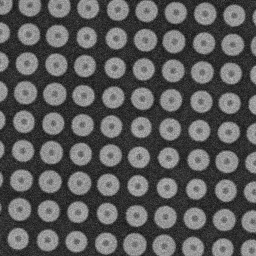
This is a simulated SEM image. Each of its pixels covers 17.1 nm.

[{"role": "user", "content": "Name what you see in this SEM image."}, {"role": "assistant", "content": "an array of small figures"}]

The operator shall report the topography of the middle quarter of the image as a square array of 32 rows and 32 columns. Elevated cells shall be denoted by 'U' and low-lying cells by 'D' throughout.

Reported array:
UDDUUUUUDDUUUUUDDUUUUUDDDUUUUUDD
UDDUUUUUDDUUUUUDDUUUUUUDDUUUUUDD
DDDUUUUDDDDUUUUDDDUUUUDDDUUUUUDD
DDDDDDDDDDDDUDDDDDUUUDDDDUUUUDDD
DDDDDDDDDDDDDDDDDDDDDDDDDDDDDDDD
DDDDUUDDDDDDDDDDDDDDDDDDDDDDDDDD
DDDUUUUDDDUUUUDDDDUUUDDDDDUUDDDD
UDUUUUUUDDUUUUUDDUUUUUDDDUUUUDDD
DDUUUUUUDDUUUUUDDUUUUUDDUUUUUDDD
DDDUUUUDDDUUUUUDDUUUUUDDUUUUUDDD
DDDDDDDDDDDUUUDDDDUUUUDDUUUUUDDD
DDDDDDDDDDDDDDDDDDDDDDDDDDUUDDDD
DDDDDDDDDDDDDDDDDDDDDDDDDDDDDDDD
DDDUUUUDDDUUUUDDDDUUDDDDDDDDDDDD
DDUUUUUDDUUUUUDDDUUUUUDDDUUUDDDD
DDUUUUUDDUUUUUDDDUUUUUDDUUUUUDDD
DDUUUUUDDUUUUUDDDUUUUUDDUUUUUDDU
DDDUUUDDDDUUUUDDDUUUUDDDUUUUUDDU
DDDDDDDDDDDDDDDDDDDDDDDDDUUUDDDD
DDDDDDDDDDDDDDDDDDDDDDDDDDDDDDDD
DDUUUUDDDDUUUDDDDDDDDDDDDDDDDDDD
DDUUUUUDDUUUUUDDDUUUUDDDDUUUDDDD
DDUUUUUDDUUUUUDDUUUUUDDDUUUUDDDU
DDUUUUUDDUUUUUDDUUUUUDDDUUUUUDDU
DDUUUUDDDUUUUUDDUUUUUDDDUUUUDDDU
DDDDDDDDDDDUDDDDDUUUDDDDDUUUDDDU
DDDDDDDDDDDDDDDDDDDDDDDDDDDDDDDD
DDUUUUDDDDDDDDDDDDDDDDDDDDDDDDDD
DUUUUUDDDUUUUDDDDUUUDDDDDDDDDDDD
DUUUUUUDUUUUUUDDUUUUUDDDUUUUDDDU
DUUUUUUDUUUUUUDDUUUUUDDUUUUUDDDU
DDUUUUDDDUUUUDDDUUUUUDDUUUUUDDDU